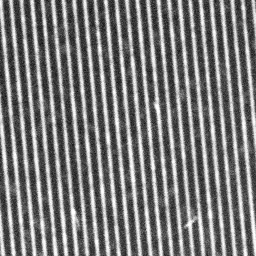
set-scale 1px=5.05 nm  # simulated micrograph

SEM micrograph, parallel lines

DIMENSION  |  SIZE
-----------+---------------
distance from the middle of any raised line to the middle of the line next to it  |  53 nm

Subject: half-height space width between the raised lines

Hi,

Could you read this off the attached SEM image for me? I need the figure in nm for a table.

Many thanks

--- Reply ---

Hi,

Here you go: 44.1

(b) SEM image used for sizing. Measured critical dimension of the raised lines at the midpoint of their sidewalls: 8.8 nm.